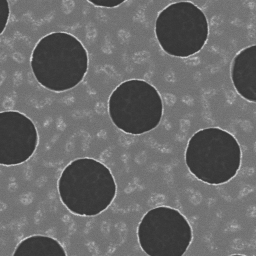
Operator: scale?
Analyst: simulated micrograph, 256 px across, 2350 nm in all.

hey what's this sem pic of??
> holes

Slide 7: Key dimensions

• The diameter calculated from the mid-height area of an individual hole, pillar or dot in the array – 55 px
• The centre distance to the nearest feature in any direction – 831 nanometers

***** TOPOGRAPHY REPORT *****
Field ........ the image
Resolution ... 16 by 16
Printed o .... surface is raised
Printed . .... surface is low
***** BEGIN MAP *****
.ooooooooo..oooo
oooooooooo...ooo
ooo..ooooo...ooo
oo...oooooo.ooo.
oo...oooooooooo.
ooo.ooo...ooooo.
ooooooo...oooooo
..ooooo...oooooo
..oooooooooo..oo
..oooooooooo...o
oooo...ooooo...o
oooo...ooooooooo
oooo...ooooooooo
ooooooooo..ooooo
ooooooooo...oooo
o...ooooo...oooo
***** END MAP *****